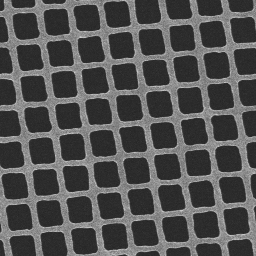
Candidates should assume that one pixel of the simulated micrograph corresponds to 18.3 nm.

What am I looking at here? a regular array of holes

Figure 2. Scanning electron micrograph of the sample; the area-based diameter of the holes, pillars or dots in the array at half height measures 27.9 pixels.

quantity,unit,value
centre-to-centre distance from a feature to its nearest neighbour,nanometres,562